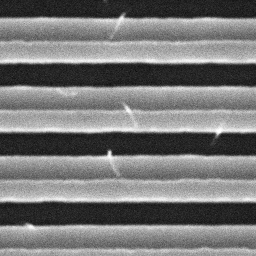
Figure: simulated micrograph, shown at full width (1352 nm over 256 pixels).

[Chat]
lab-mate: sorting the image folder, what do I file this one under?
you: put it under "lines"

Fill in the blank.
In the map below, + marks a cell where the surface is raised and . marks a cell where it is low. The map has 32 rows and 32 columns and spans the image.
................................
................................
++++++++++++++++++++++++++++++++
++++++++++++++++++++++++++++++++
++++++++++++++++++++++++++++++++
++++++++++++++++++++++++++++++++
++++++++++++++++++++++++++++++++
++++++++++++++++++++++++++++++++
................................
................................
................................
++++++++++++++++++++++++++++++++
++++++++++++++++++++++++++++++++
++++++++++++++++++++++++++++++++
++++++++++++++++++++++++++++++++
++++++++++++++++++++++++++++++++
...........................+....
................................
................................
.............+..................
++++++++++++++++++++++++++++++++
++++++++++++++++++++++++++++++++
++++++++++++++++++++++++++++++++
++++++++++++++++++++++++++++++++
++++++++++++++++++++++++++++++++
................................
................................
................................
++++++++++++++++++++++++++++++++
++++++++++++++++++++++++++++++++
++++++++++++++++++++++++++++++++
++++++++++++++++++++++++++++++++